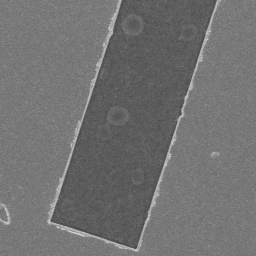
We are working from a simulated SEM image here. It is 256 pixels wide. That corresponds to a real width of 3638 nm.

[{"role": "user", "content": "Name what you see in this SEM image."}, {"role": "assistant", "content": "one or a few lines or trenches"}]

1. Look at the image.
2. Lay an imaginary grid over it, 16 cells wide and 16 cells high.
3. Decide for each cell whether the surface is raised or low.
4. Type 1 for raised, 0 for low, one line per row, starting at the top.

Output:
1111111000000111
1111111010000111
1111111000000111
1111110000001111
1111110000001111
1111110000001111
1111110000011111
1111100000011111
1111100000011111
1111100000011111
1111000000111111
1111000000111111
1111000000111111
1110000001111111
1111100001111111
1111111111111111